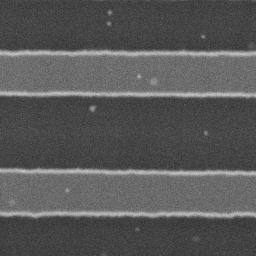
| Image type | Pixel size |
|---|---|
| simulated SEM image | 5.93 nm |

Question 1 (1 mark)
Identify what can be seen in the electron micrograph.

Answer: lines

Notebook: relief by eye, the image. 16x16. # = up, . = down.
................
................
................
################
################
################
................
................
................
................
................
################
################
................
................
................